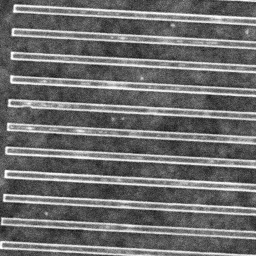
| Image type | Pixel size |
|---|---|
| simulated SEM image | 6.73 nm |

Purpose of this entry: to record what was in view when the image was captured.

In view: parallel lines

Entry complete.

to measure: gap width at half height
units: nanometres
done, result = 112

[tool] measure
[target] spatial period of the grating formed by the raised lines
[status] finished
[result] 159 nanometres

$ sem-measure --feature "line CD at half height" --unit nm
47